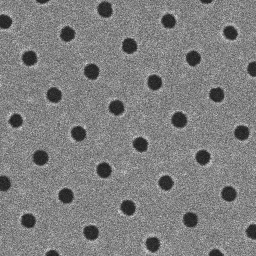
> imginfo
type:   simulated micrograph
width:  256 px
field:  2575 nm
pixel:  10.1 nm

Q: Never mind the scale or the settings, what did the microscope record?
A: a regular array of holes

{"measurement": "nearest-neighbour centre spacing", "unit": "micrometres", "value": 0.447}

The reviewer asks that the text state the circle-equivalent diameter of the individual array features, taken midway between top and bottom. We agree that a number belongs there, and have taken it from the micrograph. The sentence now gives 0.154 um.